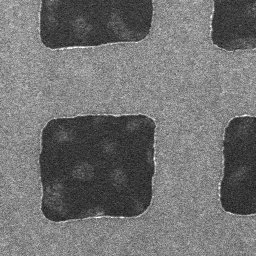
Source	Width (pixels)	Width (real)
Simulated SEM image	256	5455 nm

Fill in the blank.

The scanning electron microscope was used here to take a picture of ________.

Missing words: raised bodies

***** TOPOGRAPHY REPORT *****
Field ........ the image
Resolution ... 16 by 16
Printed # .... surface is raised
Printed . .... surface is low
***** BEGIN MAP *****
...#######...###
..#######....###
...######....###
................
................
................
................
...######......#
...#######....##
..########....##
..########....##
...#######....##
...######.....##
...######.......
................
................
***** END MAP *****